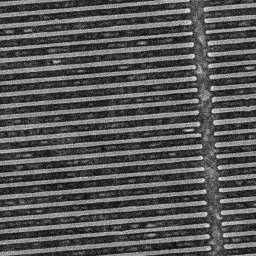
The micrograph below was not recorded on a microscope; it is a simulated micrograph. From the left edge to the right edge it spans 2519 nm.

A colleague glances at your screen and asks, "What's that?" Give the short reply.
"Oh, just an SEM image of parallel lines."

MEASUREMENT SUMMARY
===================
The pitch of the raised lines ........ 11.3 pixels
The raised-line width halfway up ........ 0.038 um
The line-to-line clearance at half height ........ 7.72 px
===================